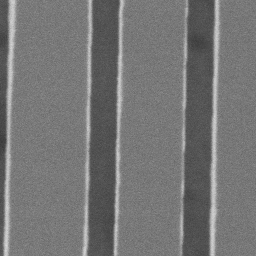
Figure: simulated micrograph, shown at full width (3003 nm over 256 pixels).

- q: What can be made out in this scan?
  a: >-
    lines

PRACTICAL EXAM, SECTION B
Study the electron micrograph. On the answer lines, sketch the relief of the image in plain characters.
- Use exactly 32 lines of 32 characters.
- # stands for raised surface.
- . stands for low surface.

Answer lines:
.##########....########....#####
.##########....########....#####
.##########....########....#####
.##########....########....#####
.##########....########....#####
.##########....########....#####
.##########....########....#####
.##########....########....#####
.##########....########....#####
.##########....########....#####
.##########....########....#####
.##########....########....#####
.##########....########....#####
.##########....########....#####
.##########....########....#####
.##########....########....#####
.##########....########....#####
.##########....########....#####
.##########....########....#####
.##########....########....#####
.##########....########....#####
.##########....########....#####
.##########....########....#####
.##########....########....#####
.##########....########....#####
.##########...#########....#####
.##########...#########...######
.##########...#########...######
.##########...#########...######
.##########...#########...######
.##########...#########...######
.##########...#########...######